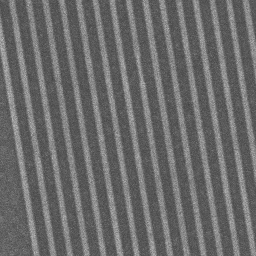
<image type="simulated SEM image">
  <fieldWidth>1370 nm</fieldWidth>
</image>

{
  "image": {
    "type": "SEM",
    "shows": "parallel lines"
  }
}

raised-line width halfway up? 23.1 nanometres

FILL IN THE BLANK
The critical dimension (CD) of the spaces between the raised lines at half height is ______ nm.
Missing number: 65.3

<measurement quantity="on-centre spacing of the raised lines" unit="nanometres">88.3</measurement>